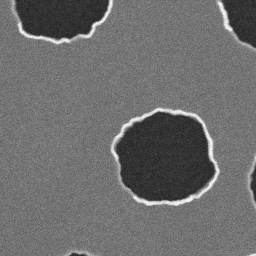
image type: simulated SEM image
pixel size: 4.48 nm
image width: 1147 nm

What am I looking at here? holes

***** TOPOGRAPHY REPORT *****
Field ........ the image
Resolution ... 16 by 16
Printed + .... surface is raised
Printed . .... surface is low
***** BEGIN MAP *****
+......+++++++..
+.....++++++++..
+++++++++++++++.
++++++++++++++++
++++++++++++++++
++++++++++++++++
++++++++++++++++
+++++++++...++++
++++++++.....+++
+++++++......+++
+++++++......+++
++++++++.....+++
+++++++++..+++++
++++++++++++++++
++++++++++++++++
++++++++++++++++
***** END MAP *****